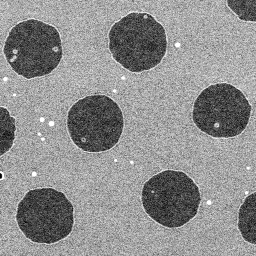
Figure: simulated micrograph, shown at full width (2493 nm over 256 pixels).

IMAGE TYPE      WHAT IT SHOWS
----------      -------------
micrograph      raised bodies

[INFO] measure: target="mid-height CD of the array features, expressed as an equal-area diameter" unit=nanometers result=573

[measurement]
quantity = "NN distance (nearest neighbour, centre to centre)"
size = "0.965 um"